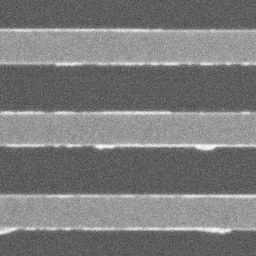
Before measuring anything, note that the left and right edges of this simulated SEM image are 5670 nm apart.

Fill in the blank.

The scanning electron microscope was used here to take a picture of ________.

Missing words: lines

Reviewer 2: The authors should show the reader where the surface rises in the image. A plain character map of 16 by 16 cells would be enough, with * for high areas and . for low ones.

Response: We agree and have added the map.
................
................
****************
****************
................
................
................
****************
****************
................
................
................
****************
****************
................
................